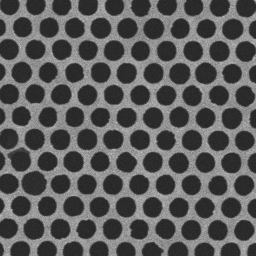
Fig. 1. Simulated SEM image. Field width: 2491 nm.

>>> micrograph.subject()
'a regular array of holes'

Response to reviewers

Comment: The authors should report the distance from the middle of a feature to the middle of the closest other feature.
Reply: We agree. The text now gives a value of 25.5 px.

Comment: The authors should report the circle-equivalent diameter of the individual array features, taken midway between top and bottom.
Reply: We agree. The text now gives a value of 0.198 µm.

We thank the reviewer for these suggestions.